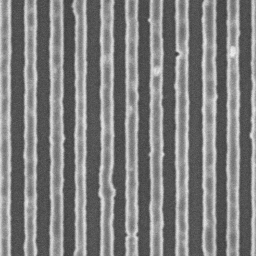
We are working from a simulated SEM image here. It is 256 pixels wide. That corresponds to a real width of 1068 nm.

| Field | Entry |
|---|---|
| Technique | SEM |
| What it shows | parallel lines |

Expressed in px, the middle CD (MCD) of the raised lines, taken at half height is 11.2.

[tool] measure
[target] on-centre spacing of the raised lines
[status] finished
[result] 106 nm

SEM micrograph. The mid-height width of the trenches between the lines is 58.4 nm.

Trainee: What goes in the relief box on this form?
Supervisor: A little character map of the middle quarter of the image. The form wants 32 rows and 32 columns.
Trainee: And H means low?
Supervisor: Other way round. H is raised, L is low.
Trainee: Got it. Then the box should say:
LLLHHLLLLHHHLLLLHHLLLLHHHLLLHHHL
LLLHHLLLLLHHLLLLHHLLLLHHHLLLHHHL
LLLHHLLLLLHHLLLLHHLLLLHHLLLLHHHL
LLLHHLLLLLHHLLLLHHLLLLHHHLLLHHHL
LLLHHLLLLLHHLLLLHHLLLLHHLLLLHHHL
LLLHHLLLLHHHLLLLHHLLLLHHLLLLHHHL
LLLHHLLLLHHHLLLLHHLLLLHHLLLLHHHL
LLLHHLLLLHHHLLLLHHLLLLHHLLLLHHHL
LLLHHLLLLHHHLLLLHHLLLLHHLLLLHHHL
LLLHHLLLLLHHLLLLHHLLLLHHLLLLHHHL
LLLHHLLLLLHHLLLLHHLLLLHHLLLLHHHL
LLLHHLLLLLHHLLLLHHLLLLHHHLLLHHHL
LLLHHLLLLHHHLLLLHHLLLLHHHLLLHHHL
LLLHHLLLLHHHLLLLHHLLLLHHHLLLHHHL
LLLHHLLLLLHHLLLLHHLLLLHHLLLLHHHL
LLLHHLLLLLHHLLLHHHLLLLHHLLLLHHHL
LLLHHLLLLLHHLLLLHHLLLLHHLLLLHHHL
LLLHHLLLLLHHLLLLHHLLLLHHHLLLHHHL
LLLHHLLLLLHHLLLLHHLLLLHHHLLLHHHL
LLLHHLLLLLHHLLLLHHLLLLHHHLLLHHHL
LLLHHLLLLLHHLLLLHHLLLLHHHLLLHHHL
LLLHHLLLLLHHLLLLHHLLLLHHHLLLHHHL
LLLHHLLLLLHHLLLLHHLLLLHHHLLLHHHL
LLLHHLLLLLHHLLLLHHLLLLHHHLLLHHHL
LLLHHLLLLLHHLLLLHHLLLLHHLLLLHHHL
LLLHHLLLLHHHLLLLHHLLLLHHLLLLHHHL
LLLHHLLLLHHHLLLLHHLLLLHHHLLLHHHL
LLLHHLLLLHHHLLLLHHLLLLHHLLLLHHHL
LLLHHLLLLHHHLLLLHHLLLLHHHLLLHHHL
LLLHHLLLLHHHLLLLHHLLLLHHHLLLHHHL
LLLHHLLLLHHHLLLLHHLLLLHHHLLLHHHL
LLLHHLLLLHHHHLLLHHLLLLHHHLLLHHHL